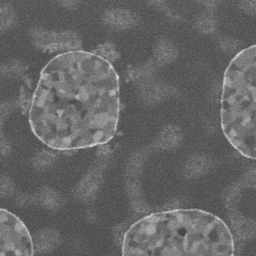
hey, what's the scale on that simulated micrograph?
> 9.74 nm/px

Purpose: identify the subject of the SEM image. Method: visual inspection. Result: raised bodies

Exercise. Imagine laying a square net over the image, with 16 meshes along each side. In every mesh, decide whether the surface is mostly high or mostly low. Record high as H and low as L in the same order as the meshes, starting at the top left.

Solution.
LLLLLLLLLLLLLLLL
LLLLLLLLLLLLLLLL
LLLLLLLLLLLLLLLL
LLLLHHLLLLLLLLLH
LLLHHHHLLLLLLLHH
LLHHHHHLLLLLLLHH
LLHHHHHLLLLLLLHH
LLHHHHHLLLLLLLHH
LLHHHHHLLLLLLLHH
LLLLLLLLLLLLLLLH
LLLLLLLLLLLLLLLL
LLLLLLLLLLLLLLLL
LLLLLLLLLLLLLLLL
HLLLLLLLLHHHHLLL
HHLLLLLLHHHHHHHL
HHLLLLLLHHHHHHHL